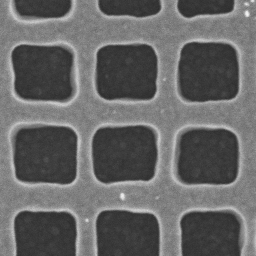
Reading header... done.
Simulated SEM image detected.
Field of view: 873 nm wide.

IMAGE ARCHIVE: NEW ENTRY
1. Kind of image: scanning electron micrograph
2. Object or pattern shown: holes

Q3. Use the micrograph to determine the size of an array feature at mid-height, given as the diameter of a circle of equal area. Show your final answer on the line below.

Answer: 225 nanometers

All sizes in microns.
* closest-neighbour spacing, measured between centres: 0.277